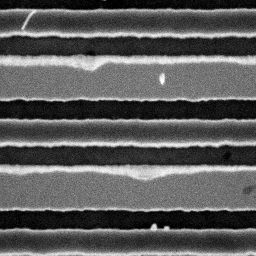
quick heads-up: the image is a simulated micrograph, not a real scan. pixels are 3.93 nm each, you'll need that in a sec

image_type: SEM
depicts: lines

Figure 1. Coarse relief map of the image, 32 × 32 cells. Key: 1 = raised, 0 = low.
00000000000000000000000000000000
11111111111111111111111111111111
11111111111111111111111111111111
11111111111111111111111111111111
10001001111101100111111111111111
00000000000000000000000000000000
00000000000000000000000000000000
11111111111111111111111111111111
11111111111111111111111111111111
11111111111111111111111111111111
11111111111111111111111111111111
11111111111111111111111111111111
11010111100100111111110111000000
00000000000000000000000000000000
00000000000000000000000000000000
11111111111111111111111111111111
11111111111111111111111111111111
11111111111111111111111111111111
00000000000000000000000000000000
00000000000000000000000000000000
00000000000000000000000000000000
11111111111111111111111111111111
11111111111111111111111111111111
11111111111111111111111111111111
11111111111111111111111111111111
11111111111111111111111111111111
00000000000000000000000000000000
00000000000000000000000000000000
00000000000000000001100000000000
11111111111111111111111111111111
11111111111111111111111111111111
11111111111111111111111111111111